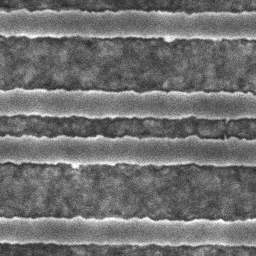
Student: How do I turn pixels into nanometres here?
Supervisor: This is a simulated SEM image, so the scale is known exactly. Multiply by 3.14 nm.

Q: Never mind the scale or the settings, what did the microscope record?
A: lines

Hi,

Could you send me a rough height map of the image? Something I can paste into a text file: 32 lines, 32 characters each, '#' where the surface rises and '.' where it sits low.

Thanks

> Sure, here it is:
................................
###########..########.........##
################################
################################
#.#######.######################
................................
................................
................................
................................
................................
................................
#############..##..#.#..........
################################
################################
.....###########################
................................
................................
###############################.
################################
################################
......#..######.################
................................
................................
................................
................................
................................
................................
###################.#...##.#...#
################################
################################
.......###..#######.############
................................